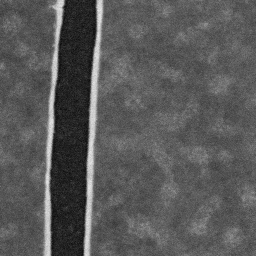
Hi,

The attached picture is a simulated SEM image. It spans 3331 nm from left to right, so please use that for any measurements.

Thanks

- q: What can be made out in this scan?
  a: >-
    one or a few lines or trenches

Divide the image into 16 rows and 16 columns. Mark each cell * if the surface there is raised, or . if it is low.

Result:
****..**********
****..**********
****..**********
***...**********
***...**********
***...**********
***...**********
***...**********
***...**********
***...**********
***...**********
***...**********
***...**********
***...**********
***...**********
***..***********